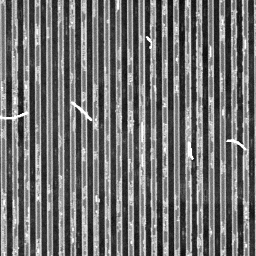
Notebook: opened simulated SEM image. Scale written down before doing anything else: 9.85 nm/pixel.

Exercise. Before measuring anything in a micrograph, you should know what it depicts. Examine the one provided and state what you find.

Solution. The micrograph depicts parallel lines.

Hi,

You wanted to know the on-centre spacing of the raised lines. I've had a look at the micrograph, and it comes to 0.114 micrometres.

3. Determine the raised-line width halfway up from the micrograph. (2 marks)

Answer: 46.8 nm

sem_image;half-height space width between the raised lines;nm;65.2